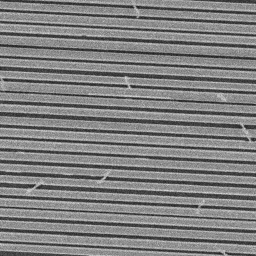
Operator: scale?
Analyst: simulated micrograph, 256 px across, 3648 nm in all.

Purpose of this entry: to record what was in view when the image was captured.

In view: parallel lines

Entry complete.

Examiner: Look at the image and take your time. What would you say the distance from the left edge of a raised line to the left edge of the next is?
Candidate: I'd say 164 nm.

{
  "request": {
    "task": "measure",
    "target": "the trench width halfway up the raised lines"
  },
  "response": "0.0676 microns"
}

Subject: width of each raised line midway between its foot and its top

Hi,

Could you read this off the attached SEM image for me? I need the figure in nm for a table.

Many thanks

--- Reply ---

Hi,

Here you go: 96